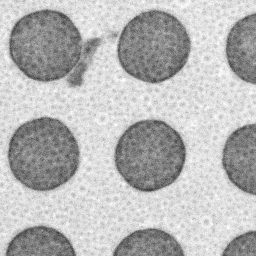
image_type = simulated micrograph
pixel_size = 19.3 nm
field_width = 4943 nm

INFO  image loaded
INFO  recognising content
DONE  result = holes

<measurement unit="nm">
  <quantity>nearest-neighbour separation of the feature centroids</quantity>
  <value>2080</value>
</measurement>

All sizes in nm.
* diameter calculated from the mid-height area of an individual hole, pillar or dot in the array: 1410